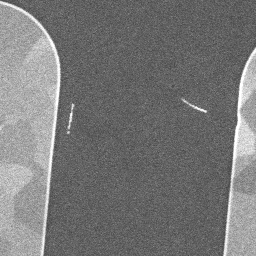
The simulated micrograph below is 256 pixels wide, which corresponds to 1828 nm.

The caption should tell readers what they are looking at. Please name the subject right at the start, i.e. one or a few lines or trenches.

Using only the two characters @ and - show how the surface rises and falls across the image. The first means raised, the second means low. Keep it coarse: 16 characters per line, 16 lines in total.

@---------------
@@--------------
@@@-------------
@@@@------------
@@@@-----------@
@@@@-----------@
@@@@-----------@
@@@------------@
@@@------------@
@@@------------@
@@@------------@
@@@-----------@@
@@@-----------@@
@@@-----------@@
@@@-----------@@
@@@-----------@@